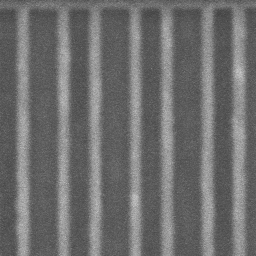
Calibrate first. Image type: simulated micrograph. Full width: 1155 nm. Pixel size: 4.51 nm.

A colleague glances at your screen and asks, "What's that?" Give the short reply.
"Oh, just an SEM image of parallel lines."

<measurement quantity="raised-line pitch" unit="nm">162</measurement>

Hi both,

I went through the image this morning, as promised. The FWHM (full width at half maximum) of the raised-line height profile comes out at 42.8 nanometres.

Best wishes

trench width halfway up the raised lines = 121 nm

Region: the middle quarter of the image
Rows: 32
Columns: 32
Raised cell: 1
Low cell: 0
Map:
10000001100000000110000001100000
10000001100000000110000001100000
10000001100000000110000001100000
10000001100000000110000001100000
10000001100000000110000001100000
10000001100000000110000001100000
10000001100000000110000001100000
10000001100000000110000001100000
10000001100000000110000001100000
10000001100000000110000001100000
10000001100000000110000001100000
10000001100000000110000001100000
10000001100000000110000001100000
10000001100000000110000001100000
10000001100000000110000001100000
10000001100000000110000001100000
10000001100000000110000001100000
10000001100000000110000001100000
10000001100000000110000011100000
10000001100000000110000001100000
10000001100000000110000001100000
10000001100000000110000001100000
10000001100000000110000001100000
10000001100000000110000001100000
10000001100000000110000001100000
10000001100000000110000001100000
10000001100000000110000001100000
10000001100000000110000001100000
10000001100000000110000001100000
10000001100000000110000001100000
10000001100000000110000001100000
10000001100000000110000001100000